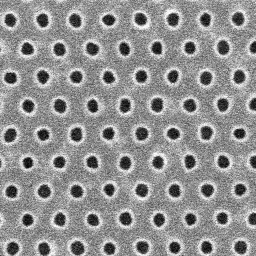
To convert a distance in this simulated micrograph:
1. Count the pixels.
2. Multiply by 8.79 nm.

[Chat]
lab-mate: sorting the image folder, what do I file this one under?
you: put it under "a regular array of holes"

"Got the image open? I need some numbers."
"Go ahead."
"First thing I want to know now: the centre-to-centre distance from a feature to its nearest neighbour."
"282 nanometers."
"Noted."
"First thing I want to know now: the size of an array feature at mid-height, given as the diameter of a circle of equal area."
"115 nanometres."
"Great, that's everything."